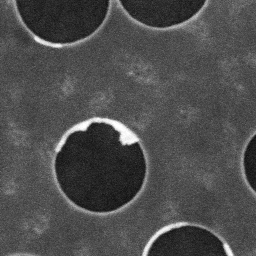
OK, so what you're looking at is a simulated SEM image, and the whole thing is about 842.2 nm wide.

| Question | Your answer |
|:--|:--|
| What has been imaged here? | holes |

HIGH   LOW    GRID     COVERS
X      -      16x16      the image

X------X-----XXX
XX----XXX--XXXXX
XXX--XXXXXXXXXXX
XXXXXXXXXXXXXXXX
XXXXXXXXXXXXXXXX
XXXXXXXXXXXXXXXX
XXXXXXXXXXXXXXXX
XXXXXXXXXXXXXXXX
XXXX---XXXXXXXXX
XXXX-----XXXXXX-
XXX------XXXXXX-
XXXX-----XXXXXXX
XXXX----XXXXXXXX
XXXXXXXXXXXXXXXX
XXXXXXXXXX---XXX
XXXXXXXXX-----XX